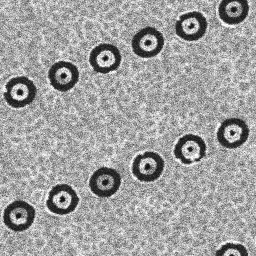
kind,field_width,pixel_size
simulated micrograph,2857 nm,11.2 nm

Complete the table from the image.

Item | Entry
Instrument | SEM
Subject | a regular array of ring-shaped grooves with a dot in the middle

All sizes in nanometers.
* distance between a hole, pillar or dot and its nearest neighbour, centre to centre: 508